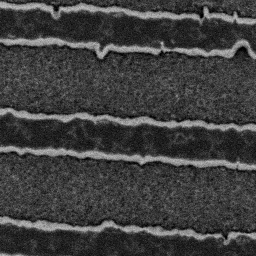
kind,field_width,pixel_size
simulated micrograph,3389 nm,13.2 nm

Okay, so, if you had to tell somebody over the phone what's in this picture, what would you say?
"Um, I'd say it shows one or a few lines or trenches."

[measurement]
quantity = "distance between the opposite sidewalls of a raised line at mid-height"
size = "0.498 micrometres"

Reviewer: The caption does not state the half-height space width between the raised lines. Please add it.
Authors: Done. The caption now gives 941 nm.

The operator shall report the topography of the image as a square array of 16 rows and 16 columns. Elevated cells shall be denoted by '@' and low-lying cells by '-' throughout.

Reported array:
@@@-@@----------
@@@@@@@@@@@@@@@@
@@@@@@@@@@@@@@@@
----------------
----------------
----------------
----------------
@@@@@@@---------
@@@@@@@@@@@@@@@@
--@@@@@@@@@@@@@@
----------------
----------------
----------------
----------------
@@@@@@@@@@-@----
@@@@@@@@@@@@@@@@